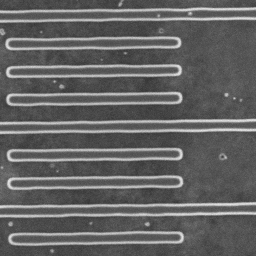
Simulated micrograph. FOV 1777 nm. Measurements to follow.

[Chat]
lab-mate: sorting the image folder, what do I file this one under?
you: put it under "groups of lines, slits or small figures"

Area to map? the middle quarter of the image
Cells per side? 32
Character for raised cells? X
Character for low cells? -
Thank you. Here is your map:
------------XXXX-----XXXXXXX----
XXXXXXXXXXXXXXXXXXXXXXXXXXXXX---
XXXXXXXXXXXXXXXXXXXXXXXXXXXXX---
--------------------------------
--------------------------------
--------------------------------
--------------------------------
----------XXX-XXXXXXXXXXXXXXX---
XXXXXXXXXXXXXXXXXXXXXXXXXXXXX---
XXXXXXXXXXXXXXXXXXXXXXXXXXXXX---
--------------------------------
--------------------------------
--------------------------------
--------------------------------
----------XXXXXXXXXXXXXXXXXXXXXX
XXXXXXXXXXXXXXXXXXXXXXXXXXXXXXXX
XXXXXXXXXXXXXXXXXXXXXXXXXXXXXXXX
--------------------------------
--------------------------------
--------------------------------
--------------------------------
XXXXXXXXXXXXXXXXXXXXXXXXXXXXX---
XXXXXXXXXXXXXXXXXXXXXXXXXXXXX---
XXXXXXXXXXXXXXXXXXXXXXXXXXXXX---
--------------------------------
--------------------------------
--------------------------------
--------------------------------
------------XXXX------XXXXXXX---
XXXXXXXXXXXXXXXXXXXXXXXXXXXXX---
XXXXXXXXXXXXXXXXXXXXXXXXXXXXX---
--------------------------------